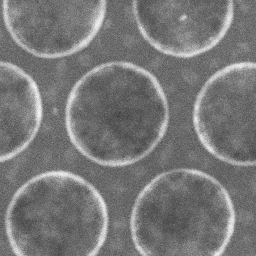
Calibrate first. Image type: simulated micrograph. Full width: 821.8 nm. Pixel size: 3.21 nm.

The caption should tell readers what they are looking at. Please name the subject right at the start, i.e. raised bodies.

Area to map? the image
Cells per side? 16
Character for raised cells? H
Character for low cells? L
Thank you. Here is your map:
HHHHHHLLHHHHHHLL
HHHHHHLLLHHHHHLL
LHHHHLLLLHHHHHLL
LLLHLLLLLLLLLLLL
HLLLLLHHHLLLLLHH
HHLLLHHHHHLLLHHH
HHLLHHHHHHLLHHHH
HHLLHHHHHHLLHHHH
HHLLHHHHHHLLHHHH
HLLLLHHHHLLLLHHH
LLLLLLLLLLLLLLLL
LLHHHLLLLHHHHHLL
LHHHHHLLLHHHHHLL
HHHHHHHLHHHHHHHL
LHHHHHHLHHHHHHLL
LHHHHHLLLHHHHHLL